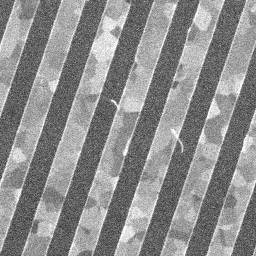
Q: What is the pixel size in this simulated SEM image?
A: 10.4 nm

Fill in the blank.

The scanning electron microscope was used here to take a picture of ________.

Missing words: parallel lines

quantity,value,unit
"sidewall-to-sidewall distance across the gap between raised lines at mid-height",0.222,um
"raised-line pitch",454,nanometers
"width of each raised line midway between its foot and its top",232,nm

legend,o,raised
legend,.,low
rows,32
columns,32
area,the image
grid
..ooo...ooo..ooo...ooo...ooo...o
.ooo...ooo...ooo...ooo...oo...oo
.ooo...ooo...ooo..ooo...ooo...oo
.ooo...oo...ooo...ooo...ooo...oo
ooo...ooo...ooo...ooo..oooo..ooo
ooo...ooo...ooo..ooo...ooo...ooo
ooo...oo...ooo...ooo...ooo...ooo
oo...ooo...ooo...ooo...oo...ooo.
oo...ooo...ooo...oo...ooo...ooo.
oo...oo...ooo...ooo...ooo...ooo.
o...ooo...ooo...ooo...ooo..ooo..
o...ooo...ooo..ooo...ooo...ooo..
o...oo...ooo...ooo...ooo...ooo..
...ooo...ooo...ooo...ooo..ooo...
...ooo...ooo..ooo...ooo...ooo...
...oo...ooo...ooo...ooo...ooo..o
..ooo...ooo...ooo...oo...ooo...o
..ooo...ooo..ooo...ooo...ooo...o
..oo...ooo...ooo...ooo...ooo..oo
.ooo...ooo...ooo...oo...ooo...oo
.ooo...ooo..ooo...ooo...ooo...oo
.oo...ooo...ooo...ooo...ooo..ooo
ooo...ooo...ooo..ooo...ooo...ooo
ooo...ooo..ooo...ooo...ooo...ooo
oo...ooo...ooo...ooo...ooo..ooo.
oo...ooo...ooo..ooo...ooo...ooo.
oo...ooo..ooo...ooo...ooo...ooo.
o...ooo...ooo...ooo...ooo..ooo..
o...ooo...ooo...oo...ooo...ooo..
o...ooo..ooo...ooo...ooo...ooo..
...ooo...ooo...ooo...ooo..ooo...
...ooo...ooo..ooo...ooo...ooo...